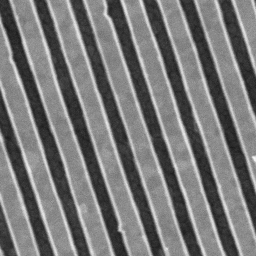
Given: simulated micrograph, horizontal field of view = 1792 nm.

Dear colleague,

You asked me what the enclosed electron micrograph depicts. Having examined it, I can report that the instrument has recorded parallel lines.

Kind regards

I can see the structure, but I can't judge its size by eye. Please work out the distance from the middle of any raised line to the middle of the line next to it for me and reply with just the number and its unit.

246 nm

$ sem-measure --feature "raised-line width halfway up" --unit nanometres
134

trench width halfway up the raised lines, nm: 116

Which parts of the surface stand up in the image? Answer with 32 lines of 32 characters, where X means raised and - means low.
-XXX--XXX--XX--XXX--XX---XX--XXX
--XX---XX--XX---XX--XXX--XX---XX
--XXX--XX--XXX--XX---XX--XXX--XX
--XXX--XXX--XX--XXX--XX---XX--XX
X--XX--XXX--XX---XX--XXX--XX---X
X--XXX--XX--XXX--XXX--XX--XXX--X
X--XXX--XXX--XX--XXX--XX--XXX--X
X---XX--XXX--XX---XX--XXX--XX---
XX--XXX--XX--XXX--XX---XX--XXX--
XX--XXX--XXX--XX--XXX--XX--XXX--
XXX--XX--XXX--XX---XX--XXX--XX--
XXX--XX---XX--XXX--XX--XXX--XXX-
-XX--XXX--XX---XX--XXX--XX--XXX-
-XXX--XX--XXX--XX---XX--XXX--XX-
-XXX--XX---XX--XXX--XX--XXX--XXX
--XX--XXX--XX---XX--XXX--XX---XX
--XX---XX--XXX--XX--XXX--XXX--XX
--XXX--XX---XX--XXX--XX---XX--XX
X--XX--XXX--XX---XX--XXX--XX--XX
X--XX---XX--XXX--XX---XX--XXX--X
X--XXX--XX---XX--XXX--XX--XXX--X
X---XX--XXX--XX---XX--XXX--XX--X
XX--XX---XX--XXX--XX--XXX--XXX--
XX--XXX--XX---XX--XXX--XX--XXX--
XXX--XX--XXX--XX---XX--XXX--XX--
XXX--XX---XX--XXX--XX--XXX--XXX-
-XX--XXX--XX---XX--XXX--XX--XXX-
-XX---XX--XXX--XX--XXX--XXX--XX-
-XXX--XX---XX--XXX--XX--XXX--XXX
--XX--XXX--XX--XXX--XXX--XX--XXX
--XX---XX--XXX--XX--XXX--XX---XX
--XXX--XX--XXX--XXX--XX--XXX--XX